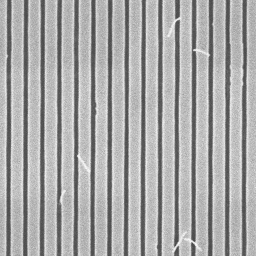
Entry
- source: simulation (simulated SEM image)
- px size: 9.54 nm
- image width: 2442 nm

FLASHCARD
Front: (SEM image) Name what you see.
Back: parallel lines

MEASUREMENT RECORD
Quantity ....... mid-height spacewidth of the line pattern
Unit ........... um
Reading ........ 0.0418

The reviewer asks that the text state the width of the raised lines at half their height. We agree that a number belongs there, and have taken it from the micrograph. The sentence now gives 117 nm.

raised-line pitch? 160 nm